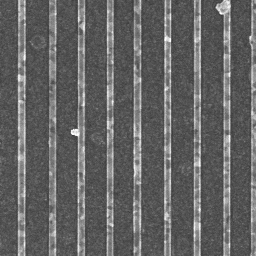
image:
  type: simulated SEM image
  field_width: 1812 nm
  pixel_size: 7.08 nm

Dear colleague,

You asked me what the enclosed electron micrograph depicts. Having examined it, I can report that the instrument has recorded parallel lines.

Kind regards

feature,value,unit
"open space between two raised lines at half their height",168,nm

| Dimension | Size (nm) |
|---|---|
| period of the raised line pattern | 207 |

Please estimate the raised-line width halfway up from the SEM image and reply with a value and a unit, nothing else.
41.6 nanometres